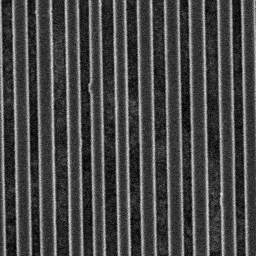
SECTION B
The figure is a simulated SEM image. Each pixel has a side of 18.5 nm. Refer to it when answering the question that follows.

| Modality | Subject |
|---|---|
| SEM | parallel lines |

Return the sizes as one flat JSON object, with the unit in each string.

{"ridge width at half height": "13.5 px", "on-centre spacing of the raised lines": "25.6 px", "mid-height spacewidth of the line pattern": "215 nm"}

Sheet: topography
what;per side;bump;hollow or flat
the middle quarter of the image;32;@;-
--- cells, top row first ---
-@@@---@@----@@@---@@@---@@@@---
-@@@---@@----@@@---@@@----@@@---
-@@@---@@----@@@---@@@----@@@---
-@@@---@@----@@@---@@@----@@@---
-@@@---@@----@@@---@@@----@@@---
-@@@--@@@----@@@---@@@----@@@---
-@@@--@@@----@@@---@@@----@@@---
-@@@---@@----@@@---@@@----@@@---
-@@@---@@@---@@@---@@@----@@@---
-@@@---@@@---@@@---@@@----@@@---
-@@@---@@@---@@@---@@@----@@@---
-@@@---@@@---@@@---@@@----@@@---
-@@@---@@@---@@@---@@@----@@@---
-@@@---@@@---@@@---@@@----@@@---
-@@@---@@@---@@@---@@@----@@@---
-@@@---@@@---@@@---@@@----@@@---
-@@@---@@@---@@@---@@@----@@@---
-@@@---@@@---@@@---@@@----@@@---
-@@@---@@@---@@@---@@@----@@@---
-@@@---@@@---@@@---@@@----@@@---
-@@@---@@@---@@@---@@@----@@@---
-@@@---@@@---@@@---@@@@---@@@---
-@@@---@@@---@@@---@@@@---@@@---
-@@@---@@@---@@@---@@@@---@@@---
-@@@---@@@---@@@---@@@@---@@@---
-@@@---@@@---@@@---@@@@---@@@---
-@@@---@@@---@@@---@@@@---@@@---
-@@@---@@@---@@@---@@@@---@@@---
-@@@---@@@---@@@---@@@@---@@@---
-@@@---@@@---@@@---@@@@---@@@---
-@@@---@@@---@@@---@@@@---@@@---
-@@@---@@@---@@@---@@@@---@@@---